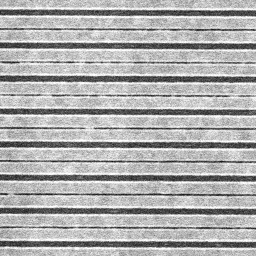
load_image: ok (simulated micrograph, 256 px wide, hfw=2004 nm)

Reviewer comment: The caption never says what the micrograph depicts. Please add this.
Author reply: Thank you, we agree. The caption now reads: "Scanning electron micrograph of parallel lines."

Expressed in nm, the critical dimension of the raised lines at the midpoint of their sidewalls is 89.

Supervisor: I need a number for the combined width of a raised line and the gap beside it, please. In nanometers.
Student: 128